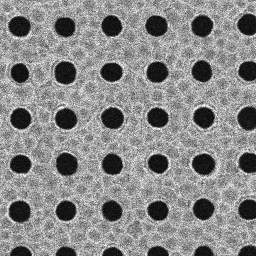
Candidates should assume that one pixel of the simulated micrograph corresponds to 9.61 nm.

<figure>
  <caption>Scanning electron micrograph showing a regular array of holes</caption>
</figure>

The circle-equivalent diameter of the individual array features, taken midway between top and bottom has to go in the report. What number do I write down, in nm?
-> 204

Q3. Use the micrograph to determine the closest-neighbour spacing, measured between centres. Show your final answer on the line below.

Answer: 434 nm